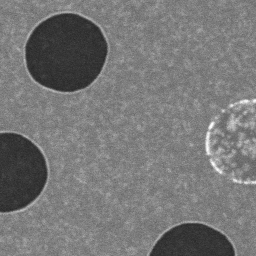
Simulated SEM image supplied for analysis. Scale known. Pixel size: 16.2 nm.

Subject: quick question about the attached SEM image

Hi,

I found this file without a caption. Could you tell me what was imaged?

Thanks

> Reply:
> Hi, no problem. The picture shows holes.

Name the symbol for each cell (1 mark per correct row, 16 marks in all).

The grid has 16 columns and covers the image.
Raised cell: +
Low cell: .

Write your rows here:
++++++++++++++++
++....++++++++++
++.....+++++++++
++.....+++++++++
++....++++++++++
+++..+++++++++++
++++++++++++++++
++++++++++++++++
.+++++++++++++++
...+++++++++++++
...+++++++++++++
...+++++++++++++
..++++++++++++++
++++++++++++++++
++++++++++....++
++++++++++.....+